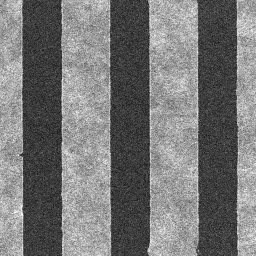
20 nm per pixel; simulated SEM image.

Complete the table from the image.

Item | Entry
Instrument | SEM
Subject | one or a few lines or trenches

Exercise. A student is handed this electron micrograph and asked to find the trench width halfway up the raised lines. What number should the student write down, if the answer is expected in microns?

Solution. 0.795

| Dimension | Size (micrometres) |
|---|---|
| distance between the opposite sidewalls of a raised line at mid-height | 0.953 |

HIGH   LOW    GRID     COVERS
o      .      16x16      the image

o...ooo..ooo...o
o...ooo..ooo...o
o...ooo..ooo...o
o...ooo..ooo...o
o...ooo..ooo...o
o...ooo..ooo...o
o...ooo..ooo...o
o...ooo..ooo...o
o...ooo..ooo...o
o...ooo..ooo...o
o...ooo..ooo...o
o...ooo..ooo...o
o...ooo..ooo...o
o...ooo..ooo...o
o...ooo..ooo...o
o...ooo..ooo...o